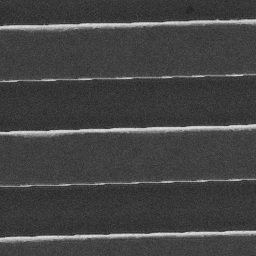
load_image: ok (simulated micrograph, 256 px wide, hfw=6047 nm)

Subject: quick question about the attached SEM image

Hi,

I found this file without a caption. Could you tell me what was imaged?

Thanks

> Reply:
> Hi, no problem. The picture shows lines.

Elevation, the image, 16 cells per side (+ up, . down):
................
.........+++++++
++++++++++++++++
++++++++++++++++
++++++++++++++++
................
................
................
++++++++++++++++
++++++++++++++++
++++++++++++++++
+++++++.........
................
................
...............+
++++++++++++++++